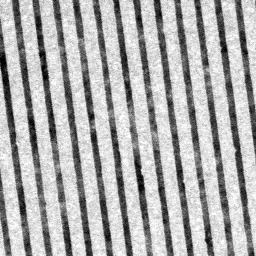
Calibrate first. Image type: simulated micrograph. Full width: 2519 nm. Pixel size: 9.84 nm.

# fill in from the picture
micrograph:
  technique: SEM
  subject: parallel lines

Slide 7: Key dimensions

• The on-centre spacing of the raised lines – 198 nanometers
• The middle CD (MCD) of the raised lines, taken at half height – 122 nm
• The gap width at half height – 73.2 nm